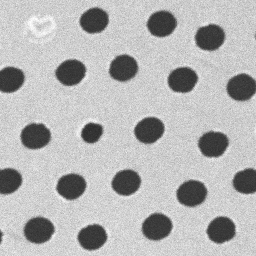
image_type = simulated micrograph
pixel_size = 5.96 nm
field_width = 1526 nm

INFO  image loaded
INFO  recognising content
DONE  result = a regular array of holes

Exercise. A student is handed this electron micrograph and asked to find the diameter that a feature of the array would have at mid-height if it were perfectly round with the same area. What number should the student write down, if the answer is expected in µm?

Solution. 0.17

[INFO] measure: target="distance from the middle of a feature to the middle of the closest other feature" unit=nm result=319